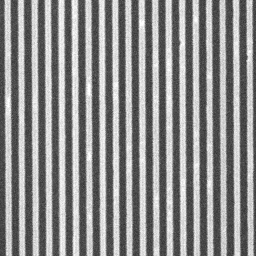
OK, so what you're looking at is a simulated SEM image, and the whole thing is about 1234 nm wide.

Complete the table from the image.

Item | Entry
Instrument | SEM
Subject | parallel lines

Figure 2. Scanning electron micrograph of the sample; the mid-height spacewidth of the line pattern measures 38 nm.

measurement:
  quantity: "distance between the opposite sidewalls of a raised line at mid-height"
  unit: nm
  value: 24.1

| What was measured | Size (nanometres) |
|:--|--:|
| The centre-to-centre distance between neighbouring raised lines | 64.8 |